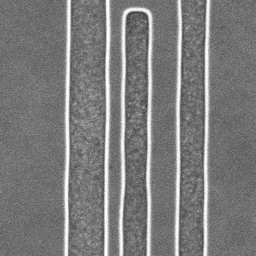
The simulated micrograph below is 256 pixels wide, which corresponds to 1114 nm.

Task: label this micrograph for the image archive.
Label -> groups of lines, slits or small figures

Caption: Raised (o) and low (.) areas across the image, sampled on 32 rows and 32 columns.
ooooooooo....ooooooooo....oooooo
ooooooooo....ooo..oooo....oooooo
ooooooooo....ooo...oooo...oooooo
ooooooooo.....oo...oooo...oooooo
ooooooooo.....oo...oooo...oooooo
ooooooooo....oo....ooo....oooooo
ooooooooo....ooo...ooo....oooooo
ooooooooo....ooo...ooo....oooooo
ooooooooo....ooo...ooo....oooooo
ooooooooo....ooo...ooo....oooooo
oooooooo.....ooo...ooo....oooooo
oooooooo.....oo....ooo....oooooo
oooooooo.....oo....ooo....oooooo
oooooooo.....oo....ooo....oooooo
oooooooo.....oo....ooo....oooooo
oooooooo.....oo....ooo....oooooo
oooooooo.....oo....ooo....oooooo
oooooooo.....oo....ooo....oooooo
oooooooo.....oo....ooo....oooooo
oooooooo.....oo....ooo....oooooo
oooooooo.....oo....ooo....oooooo
oooooooo.....oo....ooo....oooooo
oooooooo.....oo....ooo....oooooo
oooooooo.....oo....ooo....oooooo
oooooooo.....oo....ooo....oooooo
oooooooo.....oo....ooo....oooooo
oooooooo.....oo....ooo....oooooo
oooooooo.....oo....ooo....oooooo
oooooooo.....oo....ooo....oooooo
oooooooo.....oo....ooo....oooooo
oooooooo.....oo....ooo....oooooo
oooooooo.....oo....ooo....oooooo